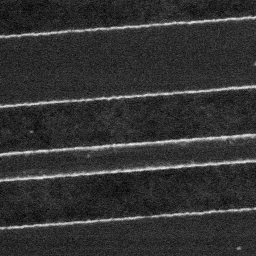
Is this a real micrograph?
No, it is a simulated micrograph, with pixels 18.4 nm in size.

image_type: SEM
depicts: lines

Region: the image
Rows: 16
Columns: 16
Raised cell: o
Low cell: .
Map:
................
..........oooooo
oooooooooooooooo
oooooooooooooooo
oooooooooooooooo
ooooooooooooooo.
oo..............
................
..............oo
.ooooooooooooooo
ooooooooooo.....
................
................
..........oooooo
oooooooooooooooo
oooooooooooooooo